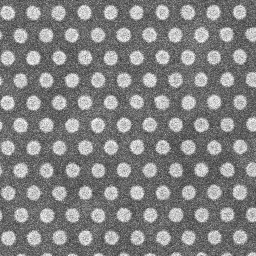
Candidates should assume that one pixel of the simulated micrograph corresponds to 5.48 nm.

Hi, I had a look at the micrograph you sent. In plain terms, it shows a regular array of raised bodies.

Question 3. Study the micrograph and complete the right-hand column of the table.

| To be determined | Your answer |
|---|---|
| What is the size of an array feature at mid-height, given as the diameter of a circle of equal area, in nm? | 71.8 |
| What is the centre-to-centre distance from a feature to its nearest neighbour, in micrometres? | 0.14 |